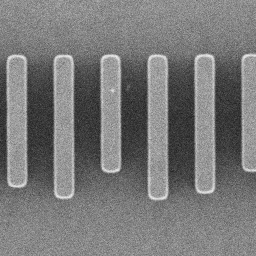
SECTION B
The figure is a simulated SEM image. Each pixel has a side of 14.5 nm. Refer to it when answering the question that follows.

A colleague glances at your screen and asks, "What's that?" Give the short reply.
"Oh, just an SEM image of groups of lines, slits or small figures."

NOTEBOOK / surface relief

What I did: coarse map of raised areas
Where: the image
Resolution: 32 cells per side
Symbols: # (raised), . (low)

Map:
................................
................................
................................
................................
................................
................................
................................
.##....##....##....##....##...##
.##....##....##....##...###...##
.##....##....##....##...###...##
.##....##....##....##...###...##
.##....##....##....##...###...##
.##....##....##....##...###...##
.##....##....##....##...###...##
.##....##....##....##...###...##
.##....##....##....##...###...##
.##....##....##....##...###...##
.##....##....##....##...###...##
.##....##....##....##....##...##
.##....##....##....##....##...##
.##....##....##....##....##...##
.##....##..........##....##.....
.##....##..........##....##.....
.......##..........##....##.....
.......##..........##...........
................................
................................
................................
................................
................................
................................
................................